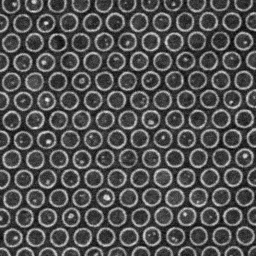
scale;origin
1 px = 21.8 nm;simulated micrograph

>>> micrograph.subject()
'a regular array of raised bodies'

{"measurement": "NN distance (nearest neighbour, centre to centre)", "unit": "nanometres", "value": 487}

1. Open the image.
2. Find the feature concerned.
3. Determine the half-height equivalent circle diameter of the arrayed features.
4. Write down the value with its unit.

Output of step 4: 382 nm